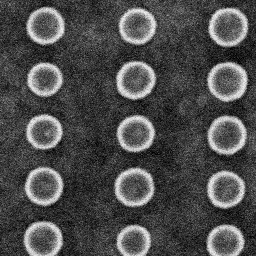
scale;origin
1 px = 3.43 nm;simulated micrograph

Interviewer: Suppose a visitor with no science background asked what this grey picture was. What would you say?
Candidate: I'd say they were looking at a regular array of raised bodies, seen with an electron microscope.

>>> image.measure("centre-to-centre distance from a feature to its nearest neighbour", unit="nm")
185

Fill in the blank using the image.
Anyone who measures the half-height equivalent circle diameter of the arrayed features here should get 120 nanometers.